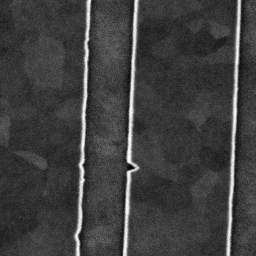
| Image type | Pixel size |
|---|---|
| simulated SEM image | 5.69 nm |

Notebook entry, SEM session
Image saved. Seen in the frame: one or a few lines or trenches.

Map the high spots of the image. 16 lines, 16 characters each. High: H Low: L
HHHHHHLLHHHHHHHL
HHHHHHLLHHHHHHHL
HHHHHLLLHHHHHHHL
HHHHHLLLHHHHHHHL
HHHHHLLLHHHHHHHL
HHHHHLLLHHHHHHHL
HHHHHLLLHHHHHHHL
HHHHHLLLHHHHHHHL
HHHHHLLLHHHHHHHL
HHHHHLLLHHHHHHHL
HHHHHLLLHHHHHHHL
HHHHHLLLHHHHHHHL
HHHHHLLLHHHHHHLL
HHHHHLLLHHHHHHLL
HHHHHLLLHHHHHHLL
HHHHHLLLHHHHHHLL